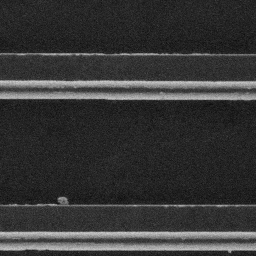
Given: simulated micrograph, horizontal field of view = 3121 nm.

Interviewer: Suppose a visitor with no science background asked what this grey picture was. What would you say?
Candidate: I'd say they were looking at lines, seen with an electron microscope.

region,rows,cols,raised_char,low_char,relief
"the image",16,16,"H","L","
LLLLLLLLLLLLLLLL
LLLLLLLLLLLLLLLL
LLLLLLLLLLLLLLLL
HHHHHHHHHHHHHHHH
HHHHHHHHHHHHHHHH
HHHHHHHHHHHHHHHH
LLLLLLLLLLLLLLLL
LLLLLLLLLLLLLLLL
LLLLLLLLLLLLLLLL
LLLLLLLLLLLLLLLL
LLLLLLLLLLLLLLLL
LLLLLLLLLLLLLLLL
LLLLLLLLLLLLLLLL
HHHHHHHHHHHHHHHH
HHHHHHHHHHHHHHHH
HHHHHHHHHHHHHHHH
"